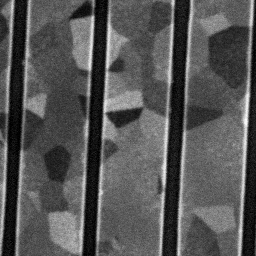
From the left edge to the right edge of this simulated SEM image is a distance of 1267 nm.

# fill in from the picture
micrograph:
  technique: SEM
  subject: one or a few lines or trenches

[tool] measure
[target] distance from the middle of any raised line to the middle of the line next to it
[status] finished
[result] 0.396 micrometres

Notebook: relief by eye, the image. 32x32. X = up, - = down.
XX--XXXXXXXX--XXXXXXXX--XXXXXXX-
XX--XXXXXXXX--XXXXXXXX--XXXXXXX-
X---XXXXXXXX--XXXXXXXX--XXXXXXX-
X---XXXXXXXX--XXXXXXXX--XXXXXXX-
X--XXXXXXXX---XXXXXXX---XXXXXXX-
X--XXXXXXXX--XXXXXXXX---XXXXXXX-
X--XXXXXXXX--XXXXXXXX---XXXXXXX-
X--XXXXXXXX--XXXXXXXX--XXXXXXXX-
X--XXXXXXXX--XXXXXXXX--XXXXXXXX-
X--XXXXXXXX--XXXXXXXX--XXXXXXXX-
X--XXXXXXXX--XXXXXXXX--XXXXXXXX-
X--XXXXXXXX--XXXXXXXX--XXXXXXXX-
X--XXXXXXXX--XXXXXXXX--XXXXXXXX-
X--XXXXXXXX--XXXXXXXX--XXXXXXXX-
X--XXXXXXXX--XXXXXXXX--XXXXXXXX-
X--XXXXXXXX--XXXXXXXX--XXXXXXXX-
X--XXXXXXXX--XXXXXXXX--XXXXXXXX-
X--XXXXXXXX--XXXXXXXX--XXXXXXXX-
X--XXXXXXXX--XXXXXXXX--XXXXXXXX-
X--XXXXXXXX--XXXXXXXX--XXXXXXXX-
X--XXXXXXXX--XXXXXXXX--XXXXXXXX-
X--XXXXXXXX--XXXXXXXX--XXXXXXX--
X--XXXXXXXX--XXXXXXX---XXXXXXX--
X--XXXXXXXX--XXXXXXX---XXXXXXX--
X-XXXXXXXX--XXXXXXXX---XXXXXXX--
--XXXXXXXX--XXXXXXXX--XXXXXXXX--
--XXXXXXXX--XXXXXXXX--XXXXXXXX--
--XXXXXXXX--XXXXXXXX--XXXXXXXX--
--XXXXXXXX--XXXXXXXX--XXXXXXXX--
--XXXXXXXX--XXXXXXXX--XXXXXXXX--
--XXXXXXXX--XXXXXXXX--XXXXXXXX--
--XXXXXXXX--XXXXXXXX--XXXXXXXX--